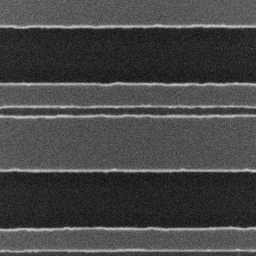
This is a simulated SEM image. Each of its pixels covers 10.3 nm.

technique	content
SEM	lines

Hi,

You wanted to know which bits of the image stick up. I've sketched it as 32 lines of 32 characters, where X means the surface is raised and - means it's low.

XXXXXXXXXXXXXXXXXXXXXXXXXXXXXXXX
XXXXXXXXXXXXXXXXXXXXXXXXXXXXXXXX
XXXXXXXXXXXXXXXXXXXXXXXXXXXXXXXX
--------------------------------
--------------------------------
--------------------------------
--------------------------------
--------------------------------
--------------------------------
--------------------------------
--------------XX-------------X--
XXXXXXXXXXXXXXXXXXXXXXXXXXXXXXXX
XXXXXXXXXXXXXXXXXXXXXXXXXXXXXXXX
XXXXXXXXXXXXXXXXXXXXXXXXXXXXXXXX
XXXXXXXXXXXXXXXXXXXXXXXXXXXXXXXX
XXXXXXXXXXXXXXXXXXXXXXXXXXXXXXXX
XXXXXXXXXXXXXXXXXXXXXXXXXXXXXXXX
XXXXXXXXXXXXXXXXXXXXXXXXXXXXXXXX
XXXXXXXXXXXXXXXXXXXXXXXXXXXXXXXX
XXXXXXXXXXXXXXXXXXXXXXXXXXXXXXXX
XXXXXXXXXXXXXXXXXXXXXXXXXXXXXXXX
--------------------------------
--------------------------------
--------------------------------
--------------------------------
--------------------------------
--------------------------------
--------------------------------
----------------------------X---
XXXXXXXXXXXXXXXXXXXXXXXXXXXXXXXX
XXXXXXXXXXXXXXXXXXXXXXXXXXXXXXXX
XXXXXXXXXXXXXXXXXXXXXXXXXXXXXXXX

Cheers